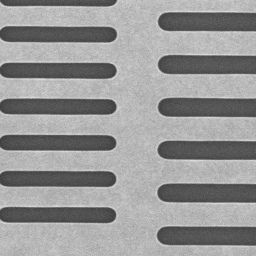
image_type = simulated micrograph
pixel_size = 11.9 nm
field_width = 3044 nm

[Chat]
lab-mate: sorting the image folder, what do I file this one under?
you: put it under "groups of lines, slits or small figures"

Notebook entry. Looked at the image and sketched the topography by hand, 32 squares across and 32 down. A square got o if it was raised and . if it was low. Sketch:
..............oooooooooooooooooo
ooooooooooooooooooooo...........
oooooooooooooooooooo............
..............oooooo............
...............ooooooooooooooooo
oooooooooooooooooooooooooooooooo
oooooooooooooooooooooooooooooooo
oooooooooooooooooooo............
..............oooooo............
..............oooooooooooooooooo
oooooooooooooooooooooooooooooooo
oooooooooooooooooooooooooooooooo
..............oooooo............
...............ooooo............
ooooooooooooooooooooo...........
oooooooooooooooooooooooooooooooo
oooooooooooooooooooooooooooooooo
..............ooooooo...oo...ooo
..............oooooo............
oooooooooooooooooooo............
oooooooooooooooooooooooooooooooo
..............oooooooooooooooooo
..............oooooooooooooooooo
oooooooooooooooooooo............
oooooooooooooooooooo............
oooooooooooooooooooooooooooooooo
..............oooooooooooooooooo
..............oooooooooooooooooo
oooooooooooooooooooo............
oooooooooooooooooooo............
oooooooooooooooooooo............
oooooooooooooooooooooooooooooooo